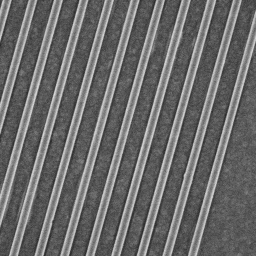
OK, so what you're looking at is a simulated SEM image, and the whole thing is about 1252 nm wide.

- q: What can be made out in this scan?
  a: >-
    parallel lines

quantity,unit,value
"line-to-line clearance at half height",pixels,16.3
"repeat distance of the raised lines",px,24.6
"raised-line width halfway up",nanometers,40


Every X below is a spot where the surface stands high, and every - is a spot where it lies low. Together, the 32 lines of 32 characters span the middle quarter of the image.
X-----XX----XX-----XX----XX----X
X----XXX----XX----XX-----XX----X
X----XX-----XX----XX----XX-----X
X----XX----XX-----XX----XX-----X
-----XX----XX----XXX----XX----XX
----XXX----XX----XX-----XX----XX
----XX-----XX----XX----XX-----XX
----XX----XX-----XX----XX-----XX
----XX----XX----XX-----XX----XX-
---XX-----XX----XX----XX-----XX-
---XX----XXX----XX----XX-----XX-
---XX----XX-----XX----XX----XX--
---XX----XX----XX-----XX----XX--
--XX-----XX----XX----XX-----XX--
--XX----XX-----XX----XX----XXX--
--XX----XX----XX-----XX----XX---
-XXX----XX----XX----XXX----XX---
-XX-----XX----XX----XXX----XX---
-XX----XX-----XX----XX----XXX---
-XX----XX----XX-----XX----XX----
XX-----XX----XX----XX-----XX----
XX----XX-----XX----XX-----XX----
XX----XX----XXX----XX----XX-----
XX----XX----XX-----XX----XX----X
X-----XX----XX----XX-----XX----X
X----XX-----XX----XX-----XX----X
X----XX----XX-----XX----XX-----X
X----XX----XX----XXX----XX----XX
----XXX----XX----XX-----XX----XX
----XX-----XX----XX----XXX----XX
----XX----XX-----XX----XX-----XX
----XX----XX----XX-----XX----XX-